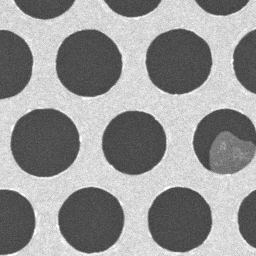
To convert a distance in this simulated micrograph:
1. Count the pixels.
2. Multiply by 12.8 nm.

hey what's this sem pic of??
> holes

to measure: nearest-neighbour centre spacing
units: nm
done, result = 1130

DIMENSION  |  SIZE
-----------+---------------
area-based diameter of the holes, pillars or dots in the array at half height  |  849 nm